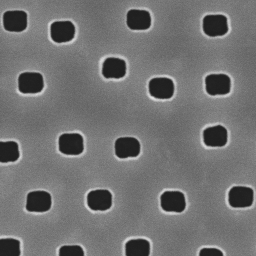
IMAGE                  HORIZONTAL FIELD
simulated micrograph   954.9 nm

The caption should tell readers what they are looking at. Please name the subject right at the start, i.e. a regular array of holes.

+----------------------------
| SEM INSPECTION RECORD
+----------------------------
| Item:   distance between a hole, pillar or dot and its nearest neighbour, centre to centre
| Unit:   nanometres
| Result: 210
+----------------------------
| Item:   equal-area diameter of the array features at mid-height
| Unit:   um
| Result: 0.0915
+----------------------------